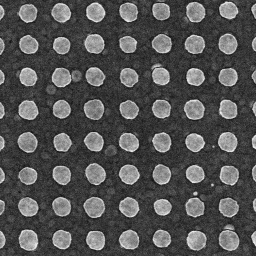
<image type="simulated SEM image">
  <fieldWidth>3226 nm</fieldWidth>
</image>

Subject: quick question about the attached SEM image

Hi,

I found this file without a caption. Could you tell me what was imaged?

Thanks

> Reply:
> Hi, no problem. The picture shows a regular array of raised bodies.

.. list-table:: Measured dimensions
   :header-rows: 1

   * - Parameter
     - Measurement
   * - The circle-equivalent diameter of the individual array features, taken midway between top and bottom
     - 0.235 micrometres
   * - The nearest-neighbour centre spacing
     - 405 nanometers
